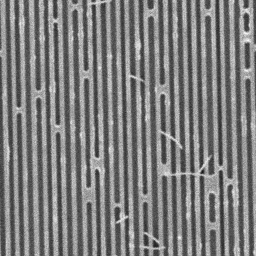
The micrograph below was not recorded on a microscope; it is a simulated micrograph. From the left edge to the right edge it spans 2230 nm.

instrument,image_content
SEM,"parallel lines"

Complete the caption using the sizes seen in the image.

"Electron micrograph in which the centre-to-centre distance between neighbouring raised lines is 0.083 um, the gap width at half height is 45.7 nm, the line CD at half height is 38.1 nm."